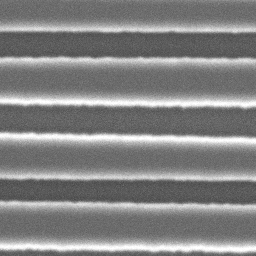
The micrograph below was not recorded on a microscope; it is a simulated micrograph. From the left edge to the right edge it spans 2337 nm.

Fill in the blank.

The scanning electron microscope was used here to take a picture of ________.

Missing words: lines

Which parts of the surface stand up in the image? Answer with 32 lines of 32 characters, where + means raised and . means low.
++++++++++++++++++++++++++++++++
++++++++++++++++++++++++++++++++
++++++++++++++++++++++++++++++++
++++++++++++++++++++++++++++++++
................................
................................
................................
++++++++++++++++++++++++++++++++
++++++++++++++++++++++++++++++++
++++++++++++++++++++++++++++++++
++++++++++++++++++++++++++++++++
++++++++++++++++++++++++++++++++
++++++++++++++++++++++++++++++++
................................
................................
................................
................................
+++++++++++++++++++++++++++++++.
++++++++++++++++++++++++++++++++
++++++++++++++++++++++++++++++++
++++++++++++++++++++++++++++++++
++++++++++++++++++++++++++++++++
................................
................................
................................
+++++++++++++++++....+..........
++++++++++++++++++++++++++++++++
++++++++++++++++++++++++++++++++
++++++++++++++++++++++++++++++++
++++++++++++++++++++++++++++++++
++++++++++++++++++++++++++++++++
................................